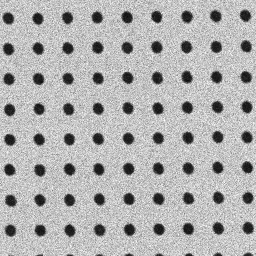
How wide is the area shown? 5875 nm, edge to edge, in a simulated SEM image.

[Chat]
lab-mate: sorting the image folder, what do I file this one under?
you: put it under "a regular array of holes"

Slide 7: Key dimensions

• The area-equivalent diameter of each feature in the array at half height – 0.273 micrometres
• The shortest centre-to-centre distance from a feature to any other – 29.6 pixels